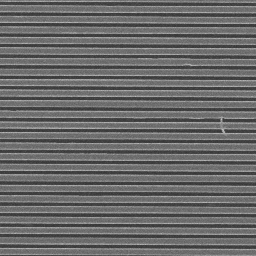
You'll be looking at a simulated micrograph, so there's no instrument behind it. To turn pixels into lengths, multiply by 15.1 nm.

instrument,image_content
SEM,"parallel lines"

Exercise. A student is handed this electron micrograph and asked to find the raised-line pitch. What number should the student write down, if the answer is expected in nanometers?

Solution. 159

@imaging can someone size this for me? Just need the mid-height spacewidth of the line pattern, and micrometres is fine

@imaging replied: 0.0642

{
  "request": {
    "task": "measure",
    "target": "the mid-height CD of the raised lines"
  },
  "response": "104 nm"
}